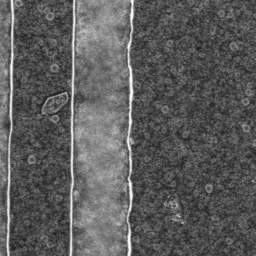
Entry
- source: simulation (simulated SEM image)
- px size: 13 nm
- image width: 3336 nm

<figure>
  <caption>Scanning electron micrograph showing one or a few lines or trenches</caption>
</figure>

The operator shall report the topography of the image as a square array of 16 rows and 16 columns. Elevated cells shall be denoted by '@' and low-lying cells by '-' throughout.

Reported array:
-@@@@---@@@@@@@@
-@@@@---@@@@@@@@
-@@@@---@@@@@@@@
-@@@@---@@@@@@@@
-@@@@---@@@@@@@@
-@@@@---@@@@@@@@
-@@@----@@@@@@@@
-@@@----@@@@@@@@
-@@@@---@@@@@@@@
-@@@@---@@@@@@@@
-@@@----@@@@@@@@
-@@@@---@@@@@@@@
-@@@----@@@@@@@@
-@@@----@@@@@@@@
-@@@----@@@@@@@@
@@@@----@@@@@@@@